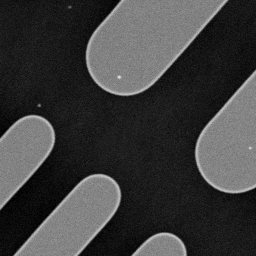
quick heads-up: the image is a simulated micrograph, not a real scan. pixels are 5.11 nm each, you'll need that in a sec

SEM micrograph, groups of lines, slits or small figures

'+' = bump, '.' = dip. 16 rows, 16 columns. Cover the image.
.......+++++++..
......+++++++...
......++++++....
.....++++++.....
......++++......
......+++......+
..............++
.++..........+++
+++..........+++
+++.........++++
++..........++++
+....++......+++
+...+++.........
...++++.........
..++++..........
.++++....+++....